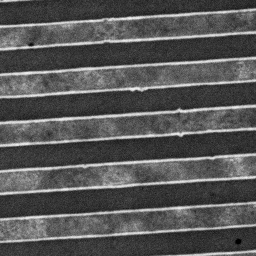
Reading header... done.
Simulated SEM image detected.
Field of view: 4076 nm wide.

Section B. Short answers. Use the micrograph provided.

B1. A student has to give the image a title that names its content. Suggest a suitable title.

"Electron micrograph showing parallel lines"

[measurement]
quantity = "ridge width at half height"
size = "23.2 px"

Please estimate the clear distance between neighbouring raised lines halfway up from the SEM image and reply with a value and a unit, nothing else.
399 nm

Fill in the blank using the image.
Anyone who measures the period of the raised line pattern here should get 767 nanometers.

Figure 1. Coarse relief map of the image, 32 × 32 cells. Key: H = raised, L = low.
LLLLLLLLLLLLLLLLLLLLLLLLLLLLLLLL
LLLLLLLLLLLLLLLLLLLLLLLLLLLHHHHH
LLLLLLLLLLLLHHHHHHHHHHHHHHHHHHHH
HHHHHHHHHHHHHHHHHHHHHHHHHHHHHHHH
HHHHHHHHHHHHHHHHHHHHHHHHHLLLLLLL
HHHHHHHHHHLLLLLLLLLLLLLLLLLLLLLL
LLLLLLLLLLLLLLLLLLLLLLLLLLLLLLLL
LLLLLLLLLLLLLLLLLLLLLLLLLLLLHHHH
LLLLLLLLLLLLLHHHHHHHHHHHHHHHHHHH
HHHHHHHHHHHHHHHHHHHHHHHHHHHHHHHH
HHHHHHHHHHHHHHHHHHHHHHHHHHLLLLLL
HHHHHHHHHHLLLLLLLLLLLLLLLLLLLLLL
LLLLLLLLLLLLLLLLLLLLLLLLLLLLLLLL
LLLLLLLLLLLLLLLLLLLLLLLLLLLLHHHH
LLLLLLLLLLLLLLHHHHHHHHHHHHHHHHHH
HHHHHHHHHHHHHHHHHHHHHHHHHHHHHHHH
HHHHHHHHHHHHHHHHHHHHHHHHHHLLLLLL
HHHHHHHHHHHLLLLLLLLLLLLLLLLLLLLL
LLLLLLLLLLLLLLLLLLLLLLLLLLLLLLLL
LLLLLLLLLLLLLLLLLLLLLLLLLLLLLLHH
LLLLLLLLLLLLLHHHHHHHHHHHHHHHHHHH
HHHHHHHHHHHHHHHHHHHHHHHHHHHHHHHH
HHHHHHHHHHHHHHHHHHHHHHHHHLLLLLLL
HHHHHHHHHHHLLLLLLLLLLLLLLLLLLLLL
LLLLLLLLLLLLLLLLLLLLLLLLLLLLLLLL
LLLLLLLLLLLLLLLLLLLLLLLLLLLLLLHH
LLLLLLLLLLLLLLLHHHHHHHHHHHHHHHHH
HHHHHHHHHHHHHHHHHHHHHHHHHHHHHHHH
HHHHHHHHHHHHHHHHHHHHHHHHHHHHLLLL
HHHHHHHHHHHHHLLLLLLLLLLLLLLLLLLL
LLLLLLLLLLLLLLLLLLLLLLLLLLLLLLLL
LLLLLLLLLLLLLLLLLLLLLLLLLLLLLLLH